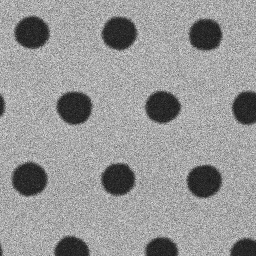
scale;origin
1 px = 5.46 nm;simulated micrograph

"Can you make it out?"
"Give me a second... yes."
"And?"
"a regular array of holes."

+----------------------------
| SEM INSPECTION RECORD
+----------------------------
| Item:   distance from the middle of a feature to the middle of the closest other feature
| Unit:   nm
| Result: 461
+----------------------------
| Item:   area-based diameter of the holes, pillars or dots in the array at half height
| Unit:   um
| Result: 0.186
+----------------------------